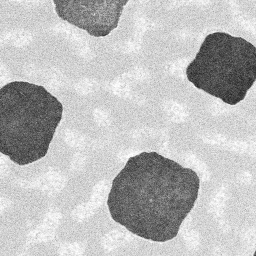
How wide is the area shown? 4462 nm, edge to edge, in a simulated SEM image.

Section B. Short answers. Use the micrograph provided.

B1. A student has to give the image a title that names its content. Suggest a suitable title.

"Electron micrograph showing holes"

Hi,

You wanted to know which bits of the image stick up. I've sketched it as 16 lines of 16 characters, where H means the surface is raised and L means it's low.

HHHLLLLLHHHHHHHH
HHHHLLLHHHHHHHHH
HHHHHHHHHHHHHLLH
HHHHHHHHHHHHLLLL
HHHHHHHHHHHHLLLL
LLLHHHHHHHHHLLLL
LLLLHHHHHHHHHHHH
LLLLHHHHHHHHHHHH
LLLHHHHHHHHHHHHH
LLLHHHHHHHHHHHHH
HHHHHHHHLLLLHHHH
HHHHHHHLLLLLHHHH
HHHHHHHLLLLLHHHH
HHHHHHHLLLLLHHHH
HHHHHHHHLLLHHHHH
HHHHHHHHHHHHHHHH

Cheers